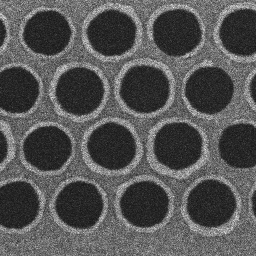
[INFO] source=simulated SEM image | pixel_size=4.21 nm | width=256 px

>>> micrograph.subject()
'a regular array of holes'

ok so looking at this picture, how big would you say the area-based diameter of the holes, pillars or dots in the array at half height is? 200 nanometers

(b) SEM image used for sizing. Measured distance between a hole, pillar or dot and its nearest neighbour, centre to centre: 271 nm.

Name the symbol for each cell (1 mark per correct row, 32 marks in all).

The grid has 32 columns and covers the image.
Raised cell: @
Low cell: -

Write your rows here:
@@@@@@@@@@@@@@@@@@@@@@@@@@@@@@@@
@@@@@--@@@@@@--@@@@@@---@@@@@---
@@@@----@@@@-----@@------@@@----
-@@------@@------@@------@@@----
-@@------@@------@@------@@-----
@@@-----@@@------@@------@@@----
@@@@----@@@@----@@@@----@@@@@---
@@@@@@@@@@@@@@@@@@@@@@@@@@@@@@@@
@--@@@@@@--@@@@@----@@@@@--@@@@@
----@@@@----@@@@-----@@@-----@@@
-----@@------@@------@@------@@-
-----@@------@@------@@------@@-
-----@@------@@------@@@-----@@@
----@@@@----@@@@----@@@@----@@@@
@@@@@@@@@@@@@@@@@@@@@@@@@@@@@@@@
@@@@@@@@@@@@@--@@@@@@--@@@@@@--@
@@@@----@@@@----@@@@-----@@@----
-@@------@@------@@------@@-----
-@@------@@------@@------@@-----
-@@------@@------@@@-----@@@----
@@@@----@@@@----@@@@----@@@@----
@@@@@@@@@@@@@@@@@@@@@@@@@@@@@@@@
@@@@@@@@@@@@@@@@@@@@@@@@@@@@@@@@
----@@@@----@@@@----@@@@-----@@@
-----@@------@@------@@@-----@@@
-----@@------@@------@@------@@-
-----@@------@@------@@@-----@@@
----@@@@----@@@@----@@@@-----@@@
@-@@@@@@@@-@@@@@@@@@@@@@@@@@@@@@
@@@@@@@@@@@@@@@@@@@@@@@@@@@@@@@@
@@@@@@@@@@@@@@@@@@@@@@@@@@@@@@@@
@@@@@@@@@@@@@@@@@@@@@@@@@@@@@@@@